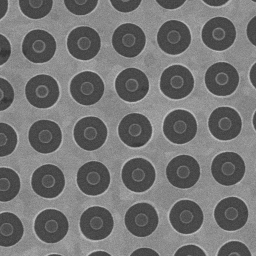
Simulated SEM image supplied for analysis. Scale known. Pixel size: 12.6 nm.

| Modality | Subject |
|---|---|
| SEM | an array of small figures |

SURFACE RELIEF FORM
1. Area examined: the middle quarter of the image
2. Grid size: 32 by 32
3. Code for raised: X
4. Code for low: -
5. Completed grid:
XXXXXXXXXXXXXXXXXXXXXXXXXX----XX
XXXXXXXXXXXXXXX----XXXXXX------X
XXX-----XXXXXX------XXXX--------
XX-------XXXX--------XXX---XX---
XX--------XXX---XX---XXX---XXX--
X---XXX---XXX--XXX---XXX---XX---
X---XXX---XXX---XX---XXX--------
XX---XX---XXX--------XXXX------X
XX-------XXXXX------XXXXXX----XX
XXX-----XXXXXXXX--XXXXXXXXXXXXXX
XXXXX-XXXXXXXXXXXXXXXXXXXXXXXXXX
XXXXXXXXXXXXXXXXXXXXXXXXXXXX--XX
XXXXXXXXXXXXXXXX---XXXXXXX------
XXXXX----XXXXXX------XXXX-------
XXX-------XXXX--------XXX---XX--
XXX-------XXXX---XX---XXX---XX--
XX---XXX---XX---XXX---XXX---XX--
XX---XXX---XXX---XX---XXX-------
XX----XX---XXX--------XXXX------
XXX-------XXXXX------XXXXXX----X
XXXX-----XXXXXXX----XXXXXXXXXXXX
XXXXX---XXXXXXXXXXXXXXXXXXXXXXXX
XXXXXXXXXXXXXXXXXXXXXXXXXXXXXXXX
XXXXXXXXXXXXXXXXX---XXXXXXX-----
XXXXXX---XXXXXXX------XXXX------
XXXX------XXXXX-------XXXX------
XXXX-------XXX----X----XX---XXX-
XXX---XXX---XX---XXX---XX---XXX-
XXX---XXX---XX---XXX---XXX------
XXX---XXX---XXX--------XXX------
XXX--------XXXX-------XXXXX-----
XXXX-------XXXXX-----XXXXXXXXXXX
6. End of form